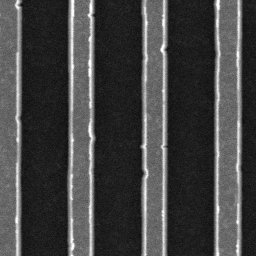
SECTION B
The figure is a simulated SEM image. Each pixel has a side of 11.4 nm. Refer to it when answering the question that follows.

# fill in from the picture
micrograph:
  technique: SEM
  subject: one or a few lines or trenches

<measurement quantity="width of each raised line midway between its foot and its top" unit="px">22.2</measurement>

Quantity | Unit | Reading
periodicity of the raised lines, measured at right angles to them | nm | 837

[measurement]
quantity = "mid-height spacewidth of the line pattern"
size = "586 nm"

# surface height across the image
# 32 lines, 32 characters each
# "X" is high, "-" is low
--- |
XX-------XX-------XXX------XXX--
XX-------XX-------XXX------XXX--
XX-------XX-------XXX------XXX--
XX-------XX-------XXX------XXX--
XX-------XX-------XXX------XXX--
XX-------XX-------XXX------XXX--
XX-------XX-------XXX------XXX--
XX-------XX-------XXX------XXX--
XX-------XX-------XXX------XXX--
XX-------XX-------XXX------XXX--
XX-------XX-------XXX------XXX--
XX-------XX-------XXX------XXX--
XX-------XX-------XXX------XXX--
XX-------XX-------XXX------XXX--
XX-------XX-------XXX------XXX--
XX-------XX-------XXX------XXX--
XX-------XXX------XXX------XXX--
XX-------XXX------XXX------XXX--
XX-------XX-------XXX------XXX--
XX-------XX-------XXX------XXX--
XX-------XX-------XXX------XXX--
XX-------XX-------XXX------XXX--
XX-------XX-------XXX------XXX--
XX-------XX-------XXX------XXX--
XX-------XX-------XXX------XXX--
XX-------XX-------XXX------XXX--
XX-------XX-------XXX------XXX--
XX-------XX-------XXX------XXX--
XX-------XX-------XXX------XXX--
XX-------XX-------XXX------XXX--
XX-------XX-------XXX------XXX--
XX-------XX-------XXX------XXX--